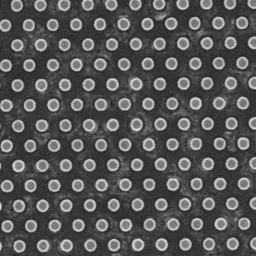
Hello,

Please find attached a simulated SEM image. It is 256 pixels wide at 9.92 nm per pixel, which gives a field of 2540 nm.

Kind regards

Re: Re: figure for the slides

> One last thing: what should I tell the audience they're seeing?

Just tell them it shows a regular array of raised bodies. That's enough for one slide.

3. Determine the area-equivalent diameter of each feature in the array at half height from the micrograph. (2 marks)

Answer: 107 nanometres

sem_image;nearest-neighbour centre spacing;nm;228